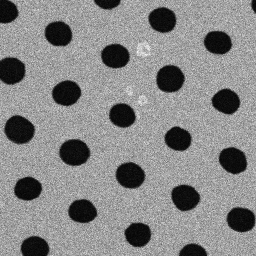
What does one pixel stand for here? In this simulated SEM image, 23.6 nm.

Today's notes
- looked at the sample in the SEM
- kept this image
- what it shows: a regular array of holes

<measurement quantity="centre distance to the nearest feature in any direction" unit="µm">1.4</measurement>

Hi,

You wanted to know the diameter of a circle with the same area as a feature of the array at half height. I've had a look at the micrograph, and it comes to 627 nm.